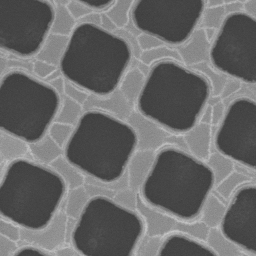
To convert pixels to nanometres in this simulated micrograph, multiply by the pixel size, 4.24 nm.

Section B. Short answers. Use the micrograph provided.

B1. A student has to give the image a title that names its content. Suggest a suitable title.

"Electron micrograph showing holes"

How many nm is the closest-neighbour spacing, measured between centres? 365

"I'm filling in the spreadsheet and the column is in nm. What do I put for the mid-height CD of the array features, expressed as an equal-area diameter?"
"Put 291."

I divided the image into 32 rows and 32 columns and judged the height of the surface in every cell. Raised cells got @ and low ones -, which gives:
------@@@@----@@@---------@@@@@@
-------@@@@@@@@@---------@@@@-@@
-------@@@@@@@@@@--------@@@----
------@@@@---@@@@-------@@@-----
------@@@------@@@@-----@@@-----
-----@@@--------@@@@@-@@@@@-----
@----@@@--------@@@@@@@@@@------
@@@@@@@@--------@@@@@@@@@@------
@@@@@@@---------@@@----@@@@-----
@---@@@@-------@@@-------@@@@---
------@@@@-----@@@--------@@@@@@
-------@@@@---@@@---------@@@@@@
--------@@@@@@@@@---------@@@---
-------@@@@@@@@@@---------@@----
-------@@@----@@@@-------@@@----
------@@@@------@@@@----@@@@----
------@@@--------@@@@@-@@@@-----
@@@--@@@@--------@@@@@@@@@@-----
@@@@@@@@---------@@@@-@@@@@-----
@@@@@@@@--------@@@-----@@@@----
@----@@@@-------@@@-------@@@@--
@------@@@------@@@--------@@@@@
--------@@@@---@@@---------@@@@@
--------@@@@@@@@@@--------@@@@--
--------@@@@-@@@@@--------@@@---
-------@@@@----@@@@-------@@@---
-------@@@-------@@@@----@@@----
@-----@@@@--------@@@@@@@@@@----
@@@---@@@---------@@@@@@@@@@----
@@@@@@@@@---------@@@--@@@@@----
@@@@@@@@@--------@@@-----@@@@---
@@----@@@@-------@@@-------@@@@-